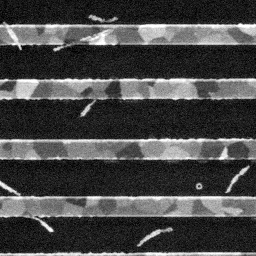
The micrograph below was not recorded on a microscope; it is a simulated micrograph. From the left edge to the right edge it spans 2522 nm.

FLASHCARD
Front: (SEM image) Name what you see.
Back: lines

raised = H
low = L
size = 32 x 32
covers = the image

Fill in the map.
LLLLLLLLLLLLLLLLLLLLLLLLLLLLLLLL
LLLLLLLLLLLLLLLLLLLLLLLLLLLLLLLL
LLLLLLLLLLLLLLLLLLLLLLLLLLLLLLLL
HHHHHHHHHHHHHHHHHHHHHHHHHHHHHHHH
HHHHHHHHHHHHHHHHHHHHHHHHHHHHHHHH
HHHHHLLLHHLLLLHLLLLLLLLLLLLLLLLL
LLLLLLLLLLLLLLLLLLLLLLLLLLLLLLLL
LLLLLLLLLLLLLLLLLLLLLLLLLLLLLLLL
LLLLLLLLLLLLLLLLLLLLLLLLLLLLLLLL
LLLLLLLLLLLLLLLLLLLLLLLLLLLLLLLL
HHHHHHHHHHHHHHHHHHHHHHHHHHHHHHHH
HHHHHHHHHHHHHHHHHHHHHHHHHHHHHHHH
LLLLLLLLLLLLLLLLLLLLLLLLLLLLLLLL
LLLLLLLLLLLLLLLLLLLLLLLLLLLLLLLL
LLLLLLLLLLLLLLLLLLLLLLLLLLLLLLLL
LLLLLLLLLLLLLLLLLLLLLLLLLLLLLLLL
LLLLLLLLLLLLLLLLLLLLLLLLLLLLLLLL
LLLLLLLLLLLLLLLLLLLLLLLLLHLLHHHH
HHHHHHHHHHHHHHHHHHHHHHHHHHHHHHHH
HHHHHHHHHHHHHHHHHHHHHHHHHHHHHHHH
LLLLLLLLLLLLLLLLLLLLLLLLLLLLLLLL
LLLLLLLLLLLLLLLLLLLLLLLLLLLLLLLL
LLLLLLLLLLLLLLLLLLLLLLLLLLLLLLLL
LLLLLLLLLLLLLLLLLLLLLLLLLLLLLLLL
LLLLLLLLLLLLLLLLLLLLLLLLLLLLLLLL
HHHHHHHHHHHHHHHHHHHHHHHHHHHHHHHH
HHHHHHHHHHHHHHHHHHHHHHHHHHHHHHHH
LLLLLLLLLLLLLLLLLLLLLLLLLLLLLLLL
LLLLLLLLLLLLLLLLLLLLLLLLLLLLLLLL
LLLLLLLLLLLLLLLLLLLLLLLLLLLLLLLL
LLLLLLLLLLLLLLLLLLLLLLLLLLLLLLLL
LLLLLLLLLLLLLLLLLLLLLLLLLLLLLLLL